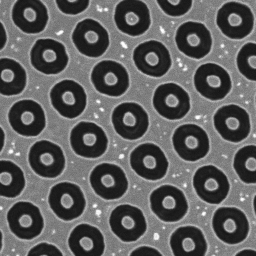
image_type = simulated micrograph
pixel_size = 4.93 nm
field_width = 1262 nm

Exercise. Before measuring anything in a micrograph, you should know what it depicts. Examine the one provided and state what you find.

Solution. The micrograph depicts a regular array of ring-shaped grooves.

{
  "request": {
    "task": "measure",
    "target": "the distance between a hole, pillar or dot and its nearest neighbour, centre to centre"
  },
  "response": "223 nanometres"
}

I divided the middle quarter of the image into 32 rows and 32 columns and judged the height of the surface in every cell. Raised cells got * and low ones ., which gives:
.*******.......***.........*****
*******........****.......******
*******....*....*****....*******
*******...***...****************
...****...***...****************
....****........********.....***
.....***........*******.......**
**...*****.....********........*
***...****************...***...*
***...****************...****..*
.....*********.....***....**....
.....********.......***........*
....********...**....***.......*
*..*********...***...*****...***
*****.******...***...***********
***.....****.........********...
**........***........*******....
**...**...****......*******.....
**...***...****....********....*
**...***...****************...**
**.........********....****....*
**........*******.......****....
***.......*******........****...
*******.********....***...***...
****************....***...******
********.....****...***...******
*******.......***.........******
*******........***.......*******
******...***...*****....********
.*****...****...****************
...****...**....********...*****
....****........*******......***